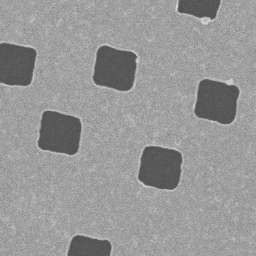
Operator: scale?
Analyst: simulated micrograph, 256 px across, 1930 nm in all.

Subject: holes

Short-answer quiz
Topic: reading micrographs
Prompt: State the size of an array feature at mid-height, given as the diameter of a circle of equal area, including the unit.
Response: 0.335 um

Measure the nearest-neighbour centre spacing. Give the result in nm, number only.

648